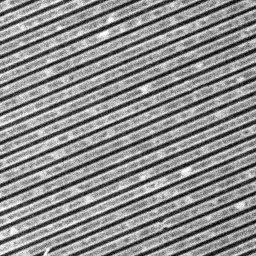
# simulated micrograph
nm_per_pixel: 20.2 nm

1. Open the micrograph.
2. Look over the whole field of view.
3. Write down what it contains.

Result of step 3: parallel lines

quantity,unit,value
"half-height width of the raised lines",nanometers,168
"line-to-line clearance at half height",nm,105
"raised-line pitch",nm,266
